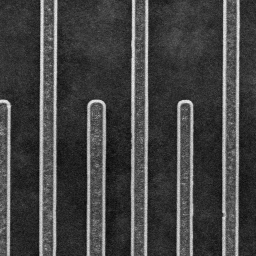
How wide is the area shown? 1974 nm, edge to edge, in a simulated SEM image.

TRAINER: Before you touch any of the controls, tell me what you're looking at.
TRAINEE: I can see parallel lines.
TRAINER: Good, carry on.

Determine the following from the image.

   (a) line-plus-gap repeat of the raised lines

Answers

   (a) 0.352 µm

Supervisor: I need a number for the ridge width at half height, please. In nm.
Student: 108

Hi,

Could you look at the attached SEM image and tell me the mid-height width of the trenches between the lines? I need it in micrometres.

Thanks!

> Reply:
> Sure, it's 0.247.